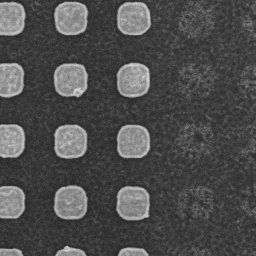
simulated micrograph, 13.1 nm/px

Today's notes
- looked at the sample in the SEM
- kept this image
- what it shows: a regular array of raised bodies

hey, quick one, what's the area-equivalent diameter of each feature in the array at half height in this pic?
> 0.445 um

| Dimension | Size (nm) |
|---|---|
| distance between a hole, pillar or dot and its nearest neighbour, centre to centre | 805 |